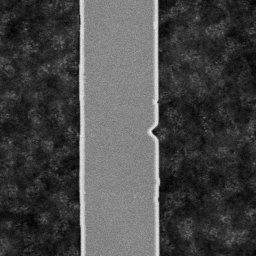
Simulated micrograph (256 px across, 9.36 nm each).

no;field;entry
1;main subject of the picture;one or a few lines or trenches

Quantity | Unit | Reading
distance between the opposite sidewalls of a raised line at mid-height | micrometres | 0.705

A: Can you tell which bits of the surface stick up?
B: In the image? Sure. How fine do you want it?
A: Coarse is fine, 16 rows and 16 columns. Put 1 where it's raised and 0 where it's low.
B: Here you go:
0000011111000000
0000011111000000
0000011111000000
0000011111000000
0000011111000000
0000011111000000
0000011111000000
0000011111000000
0000011111000000
0000011111000000
0000011111000000
0000011111000000
0000011111000000
0000011111000000
0000011111000000
0000011111000000